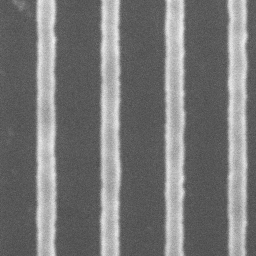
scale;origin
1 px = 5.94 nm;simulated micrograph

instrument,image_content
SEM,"lines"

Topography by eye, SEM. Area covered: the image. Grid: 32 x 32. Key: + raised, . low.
.....++......++......++......++.
.....++......++......++......++.
.....++......++......++......++.
.....++......++......++......++.
.....++......++......++......++.
.....++......++......++......++.
.....++......++......++......++.
.....++......++......++......++.
.....++......++......++......++.
.....++......++......++......++.
.....++......++......++......++.
.....++......++......++......++.
.....++......++......++......++.
.....++......++......++......++.
.....++......++......++......++.
.....++......++......++......++.
.....++......++......++......++.
.....++......++......++......++.
.....++......++......++......++.
.....++......++......++......++.
.....++......++......++......++.
.....++......++......++......++.
.....++......++......++......++.
.....++......++......++......++.
.....++......++......++......++.
.....++......++......++......++.
.....++......++......++......++.
.....++......++......++......++.
.....++......++......++......++.
.....++......++......++......++.
.....++......++......++......++.
.....++......++......++......++.